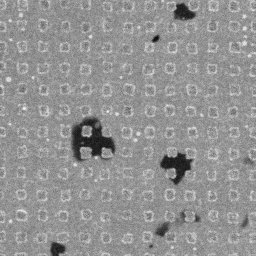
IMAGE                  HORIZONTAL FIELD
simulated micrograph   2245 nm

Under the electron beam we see a regular array of raised bodies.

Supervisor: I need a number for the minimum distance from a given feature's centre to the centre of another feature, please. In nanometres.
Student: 171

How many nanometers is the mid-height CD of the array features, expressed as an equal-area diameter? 93.6